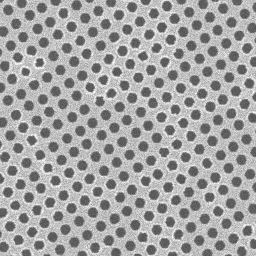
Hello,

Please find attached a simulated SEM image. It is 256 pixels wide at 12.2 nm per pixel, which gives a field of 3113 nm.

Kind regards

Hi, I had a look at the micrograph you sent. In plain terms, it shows a regular array of holes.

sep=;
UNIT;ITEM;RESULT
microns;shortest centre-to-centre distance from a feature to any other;0.181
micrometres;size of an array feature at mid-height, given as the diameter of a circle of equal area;0.13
